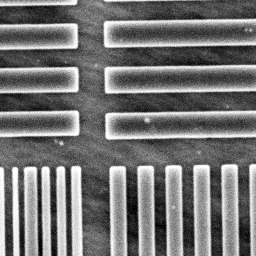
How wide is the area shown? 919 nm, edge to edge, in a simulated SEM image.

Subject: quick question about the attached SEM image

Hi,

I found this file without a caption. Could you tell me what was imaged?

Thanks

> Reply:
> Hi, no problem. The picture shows groups of lines, slits or small figures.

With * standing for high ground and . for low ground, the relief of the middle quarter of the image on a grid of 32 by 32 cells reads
................................
***.......**********************
***.......**********************
***.......**********************
***.......**********************
***.......**********************
***.......**********************
................................
................................
................................
................................
................................
***........*********************
****.......*********************
****.......*********************
****.......*********************
****.......*********************
***........*********************
...........****.**..............
................................
................................
................................
................................
................................
................................
...........................**...
..**........***....***....***...
..**........***....***....***...
..**........***....***....***...
..**........***....***....***...
..**........***....***....***...
..**........***....***....***...